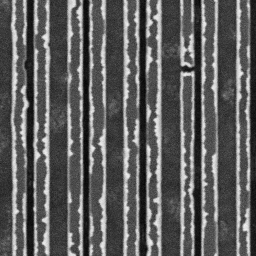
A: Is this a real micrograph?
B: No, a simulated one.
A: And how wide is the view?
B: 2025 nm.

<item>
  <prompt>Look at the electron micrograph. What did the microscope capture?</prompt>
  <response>parallel lines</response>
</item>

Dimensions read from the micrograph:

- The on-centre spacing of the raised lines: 221 nm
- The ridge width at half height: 114 nm